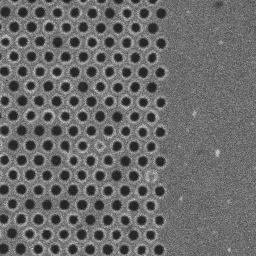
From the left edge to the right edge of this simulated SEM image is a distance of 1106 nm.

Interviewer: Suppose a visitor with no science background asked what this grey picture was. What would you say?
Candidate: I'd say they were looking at a regular array of holes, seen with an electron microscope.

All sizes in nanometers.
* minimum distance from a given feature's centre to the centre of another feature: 72.4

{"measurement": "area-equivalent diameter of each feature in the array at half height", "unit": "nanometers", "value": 41.9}